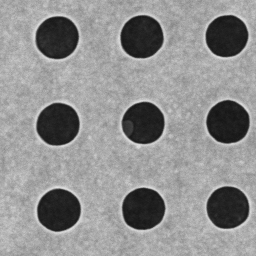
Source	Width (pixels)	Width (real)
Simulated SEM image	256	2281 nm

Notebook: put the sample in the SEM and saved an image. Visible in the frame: a regular array of holes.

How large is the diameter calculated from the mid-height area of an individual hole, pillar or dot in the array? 385 nm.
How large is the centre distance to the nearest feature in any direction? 0.753 um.